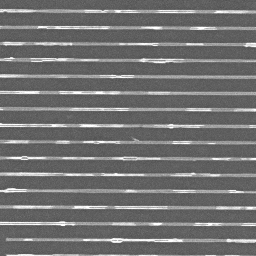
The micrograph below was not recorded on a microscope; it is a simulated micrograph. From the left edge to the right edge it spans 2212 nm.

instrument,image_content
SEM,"parallel lines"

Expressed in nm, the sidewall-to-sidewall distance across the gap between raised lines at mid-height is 120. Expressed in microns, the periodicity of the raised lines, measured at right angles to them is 0.141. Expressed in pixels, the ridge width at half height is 2.63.